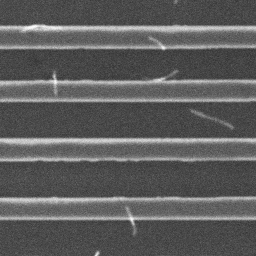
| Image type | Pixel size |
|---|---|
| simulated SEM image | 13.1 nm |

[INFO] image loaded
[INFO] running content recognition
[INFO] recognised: lines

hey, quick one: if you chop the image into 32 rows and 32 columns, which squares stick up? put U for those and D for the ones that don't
DDDDDDDDDDDDDDDDDDDDDDDDDDDDDDDD
DDDDDDDDDDDDDDDDDDDDDDDDDDDDDDDD
DDDDDDDDDDDDDDDDDDDDDDDDDDDDDDDD
UUUUUUUUUUUUUUUUUUUUUUUUUUUUUUUU
UUUUUUUUUUUUUUUUUUUUUUUUUUUUUUUU
UUUUUUUUUUUUUUUUUUUUUUUUUUUUUUUU
DDDDDDDDDDDDDDDDDDDDDDDDDDDDDDDD
DDDDDDDDDDDDDDDDDDDDDDDDDDDDDDDD
DDDDDDDDDDDDDDDDDDDDDDDDDDDDDDDD
DDDDDDDDDDDDDDDDDDDDDDDDDDDDDDDD
UUUUUUUUUUUUUUUUUUUUUUUUUUUUUUUU
UUUUUUUUUUUUUUUUUUUUUUUUUUUUUUUU
UUUUUUUUUUUUUUUUUUUUUUUUUUUUUUUU
DDDDDDDDDDDDDDDDDDDDDDDDDDDDDDDD
DDDDDDDDDDDDDDDDDDDDDDDDDDDDDDDD
DDDDDDDDDDDDDDDDDDDDDDDDDDDDDDDD
DDDDDDDDDDDDDDDDDDDDDDDDDDDDDDDD
UUUDUUUUUUUUUUUUUUUUUUUUUUUUUUUU
UUUUUUUUUUUUUUUUUUUUUUUUUUUUUUUU
UUUUUUUUUUUUUUUUUUUUUUUUUUUUUUUU
DDDDDDDDDDDDDDDDDDDDDDDDDDDDDDDD
DDDDDDDDDDDDDDDDDDDDDDDDDDDDDDDD
DDDDDDDDDDDDDDDDDDDDDDDDDDDDDDDD
DDDDDDDDDDDDDDDDDDDDDDDDDDDDDDDD
DDDDDDDDDDDDDDDDDDDDDDDDDDDDDDDD
UUUUUUUUUUUUUUUUUUUUUUUUUUUUUUUU
UUUUUUUUUUUUUUUUUUUUUUUUUUUUUUUU
DDDDDDDDDDDDDDDDUDDDDDDDDDDDDDDD
DDDDDDDDDDDDDDDDDDDDDDDDDDDDDDDD
DDDDDDDDDDDDDDDDDDDDDDDDDDDDDDDD
DDDDDDDDDDDDDDDDDDDDDDDDDDDDDDDD
DDDDDDDDDDDDDDDDDDDDDDDDDDDDDDDD